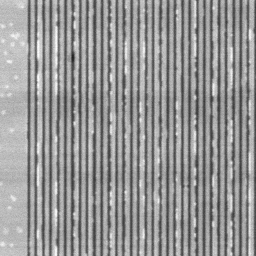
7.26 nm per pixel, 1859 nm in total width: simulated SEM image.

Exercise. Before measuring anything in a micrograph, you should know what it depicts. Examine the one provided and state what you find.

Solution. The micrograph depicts parallel lines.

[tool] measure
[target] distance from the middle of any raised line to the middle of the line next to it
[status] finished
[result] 53.2 nm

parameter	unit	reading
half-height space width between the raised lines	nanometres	28.1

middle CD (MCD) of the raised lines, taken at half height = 0.0281 um